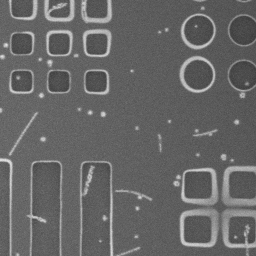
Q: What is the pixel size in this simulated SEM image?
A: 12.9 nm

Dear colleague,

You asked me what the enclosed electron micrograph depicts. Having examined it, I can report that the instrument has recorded groups of lines, slits or small figures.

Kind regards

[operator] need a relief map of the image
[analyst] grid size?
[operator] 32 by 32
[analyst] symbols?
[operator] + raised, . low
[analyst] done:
+...++...++...++++++++++++++++++
+...++...++...++++++++++++++++++
++++++++++++.++++++++++...+++...
+++++++++++++++++++++++....++...
++..++...++...+++++++++....++...
+...++...++...++++++++++..++++.+
++..++...++..+++++++++++++++++++
++++++++++++++++++++++++.+++++++
+++++++++++++++++++++++....++...
+...++...++..++++++++++....++...
+...++...++..++++++++++...+++...
++.++++.+++..+++++++++++++++++++
++++++++++++++++++++++++++++++++
++++++++++++++++++++++++++++++++
++++++++++++++++++++++++++++++++
++++++++++++++++++++++++++++++++
++++++++++++++++++++++++++++++++
++++++++++++++++++++++++++++++++
++++++++++++++++++++++++++++++++
++++++++++++++++++++++++++++++++
.+++...++++..+++++++++++++++++++
.+++....++....+++++++++...+++...
.+++....++....+++++++++....+....
.+++....++....+++++++++....+....
.+++....++....+++++++++....+....
.+++....++....++++++++++++++++++
.+++....++....+++++++++++.++++++
.+++....++....+++++++++....+....
.+++....++....+++++++++....+....
.+++....++....+++++++++....+....
.+++....++....++++++++++..+++...
.+++....++....++++++++++++++++++